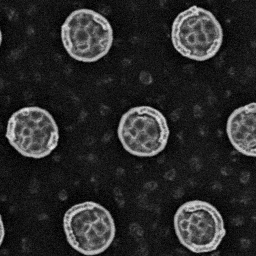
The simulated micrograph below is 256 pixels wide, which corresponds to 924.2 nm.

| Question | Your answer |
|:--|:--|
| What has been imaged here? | raised bodies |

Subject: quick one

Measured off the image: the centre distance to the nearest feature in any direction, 398 nm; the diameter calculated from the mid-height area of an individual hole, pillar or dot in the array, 178 nm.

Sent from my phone